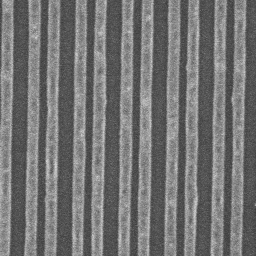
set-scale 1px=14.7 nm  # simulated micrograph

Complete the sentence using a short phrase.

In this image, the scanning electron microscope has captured parallel lines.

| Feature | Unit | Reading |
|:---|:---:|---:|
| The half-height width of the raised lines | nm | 158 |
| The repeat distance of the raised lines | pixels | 23.1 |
